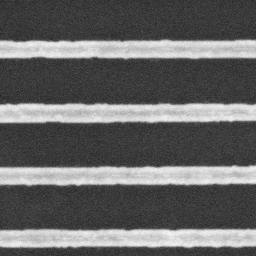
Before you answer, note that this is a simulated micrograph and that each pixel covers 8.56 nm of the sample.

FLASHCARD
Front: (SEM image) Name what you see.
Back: lines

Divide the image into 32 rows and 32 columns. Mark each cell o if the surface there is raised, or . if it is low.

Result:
................................
................................
................................
................................
................................
oooooooooooooooooooooooooooooooo
oooooooooooooooooooooooooooooooo
................................
................................
................................
................................
................................
................................
oooooooooooooooooooooooooooooooo
oooooooooooooooooooooooooooooooo
................................
................................
................................
................................
................................
................................
oooooooooooooooooooooooooooooooo
oooooooooooooooooooooooooooooooo
................................
................................
................................
................................
................................
................................
oooooooooooooooooooooooooooooooo
oooooooooooooooooooooooooooooooo
................................